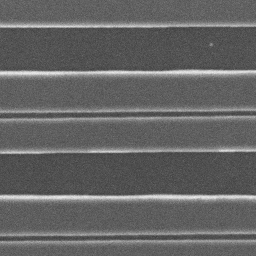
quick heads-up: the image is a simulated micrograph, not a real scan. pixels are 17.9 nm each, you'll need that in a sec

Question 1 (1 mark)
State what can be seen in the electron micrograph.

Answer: lines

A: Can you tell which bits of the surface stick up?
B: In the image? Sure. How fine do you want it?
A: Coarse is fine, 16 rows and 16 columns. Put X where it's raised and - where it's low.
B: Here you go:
XXXXXXXXXXXXXXXX
XXXXXXXXXXXXXXXX
----------------
----------------
----------------
XXXXXXXXXXXXXXXX
XXXXXXXXXXXXXXXX
XXXXXXXXXXXXXXXX
XXXXXXXXXXXXXXXX
XXXXXXX---------
----------------
----------------
XXXXXXXXXXXXXXXX
XXXXXXXXXXXXXXXX
XXXXXXXXXXXXXXXX
XXXXXXXXXXXXXXXX